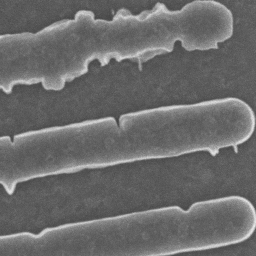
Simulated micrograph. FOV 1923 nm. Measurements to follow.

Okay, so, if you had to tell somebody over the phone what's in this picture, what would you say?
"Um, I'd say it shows one or a few lines or trenches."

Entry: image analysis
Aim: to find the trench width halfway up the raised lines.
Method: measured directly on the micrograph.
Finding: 403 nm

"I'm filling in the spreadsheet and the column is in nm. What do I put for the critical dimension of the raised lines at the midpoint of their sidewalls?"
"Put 340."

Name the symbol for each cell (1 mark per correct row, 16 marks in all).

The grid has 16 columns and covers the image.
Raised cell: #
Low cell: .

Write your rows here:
...........###..
....###########.
##############..
#########.......
#####...........
#..#............
............###.
......##########
.###############
############....
#####...........
#...............
..............#.
........########
...#############
#############...